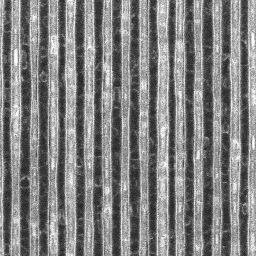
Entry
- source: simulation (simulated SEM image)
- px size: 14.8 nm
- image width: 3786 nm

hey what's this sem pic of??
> parallel lines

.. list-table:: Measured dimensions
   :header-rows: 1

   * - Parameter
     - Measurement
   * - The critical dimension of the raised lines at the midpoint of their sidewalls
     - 170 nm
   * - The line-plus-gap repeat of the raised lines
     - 18.2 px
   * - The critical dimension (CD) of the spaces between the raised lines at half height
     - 105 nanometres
